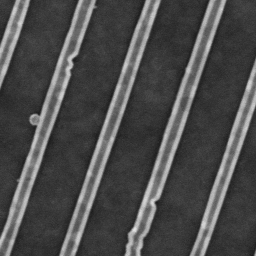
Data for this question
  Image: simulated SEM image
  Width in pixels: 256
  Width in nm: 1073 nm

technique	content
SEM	one or a few lines or trenches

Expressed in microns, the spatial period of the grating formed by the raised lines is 0.259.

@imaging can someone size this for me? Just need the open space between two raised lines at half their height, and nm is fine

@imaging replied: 210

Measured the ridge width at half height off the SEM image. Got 46.7 nm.